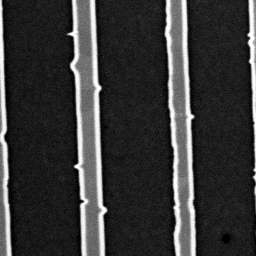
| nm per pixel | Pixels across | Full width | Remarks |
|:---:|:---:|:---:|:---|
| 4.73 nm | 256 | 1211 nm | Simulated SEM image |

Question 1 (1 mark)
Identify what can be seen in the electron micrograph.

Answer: one or a few lines or trenches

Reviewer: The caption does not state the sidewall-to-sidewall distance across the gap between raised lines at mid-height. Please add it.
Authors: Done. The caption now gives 0.351 microns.